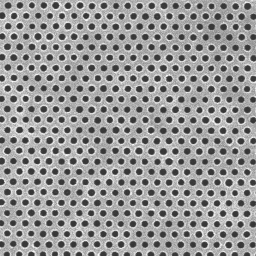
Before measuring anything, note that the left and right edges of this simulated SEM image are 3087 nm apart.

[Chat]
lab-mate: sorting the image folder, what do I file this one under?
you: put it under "a regular array of holes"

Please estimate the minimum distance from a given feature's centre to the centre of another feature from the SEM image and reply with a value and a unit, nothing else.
0.14 um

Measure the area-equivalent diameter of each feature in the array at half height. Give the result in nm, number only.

79.4